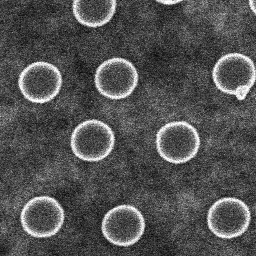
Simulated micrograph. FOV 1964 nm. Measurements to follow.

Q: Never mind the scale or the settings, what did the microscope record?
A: a regular array of raised bodies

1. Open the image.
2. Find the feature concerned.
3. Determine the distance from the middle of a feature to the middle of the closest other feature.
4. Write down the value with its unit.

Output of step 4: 624 nm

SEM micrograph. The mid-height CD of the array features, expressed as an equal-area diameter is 308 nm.